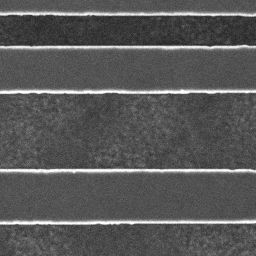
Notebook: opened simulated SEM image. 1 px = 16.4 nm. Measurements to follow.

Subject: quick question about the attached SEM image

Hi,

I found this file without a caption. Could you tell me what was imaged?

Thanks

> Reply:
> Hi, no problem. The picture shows lines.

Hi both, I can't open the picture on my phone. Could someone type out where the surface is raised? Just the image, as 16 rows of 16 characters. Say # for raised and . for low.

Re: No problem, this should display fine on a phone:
################
................
................
################
################
################
................
................
................
................
................
################
################
################
................
................